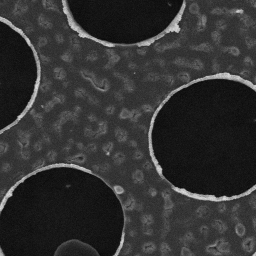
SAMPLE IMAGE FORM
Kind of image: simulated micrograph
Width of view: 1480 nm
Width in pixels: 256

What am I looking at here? holes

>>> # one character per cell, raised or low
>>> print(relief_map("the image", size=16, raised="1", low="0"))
1111000000011111
1111100000011111
0011110001111111
0011111111111111
0011111111111111
0011111111110000
0011111111000000
0111111111000000
1111111110000000
1111111111000000
1111011111000000
1000000111100000
1000000111111111
0000000011111111
0000000011111111
0000000111111111